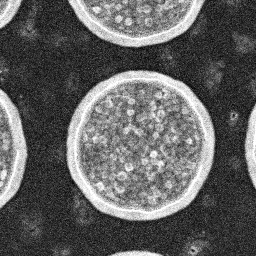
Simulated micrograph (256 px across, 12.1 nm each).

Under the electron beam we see raised bodies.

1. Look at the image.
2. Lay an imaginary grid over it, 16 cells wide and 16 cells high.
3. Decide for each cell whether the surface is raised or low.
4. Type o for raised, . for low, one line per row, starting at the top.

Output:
o....ooooooo....
......ooooo.....
........o.......
................
................
......ooooo.....
.....ooooooo....
o....oooooooo...
o....oooooooo...
o....oooooooo...
o....oooooooo...
o....ooooooo....
......ooooo.....
................
................
................